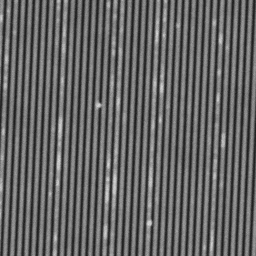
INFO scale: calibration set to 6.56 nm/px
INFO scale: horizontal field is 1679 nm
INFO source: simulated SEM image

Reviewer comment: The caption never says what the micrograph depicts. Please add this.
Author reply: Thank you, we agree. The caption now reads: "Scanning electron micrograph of parallel lines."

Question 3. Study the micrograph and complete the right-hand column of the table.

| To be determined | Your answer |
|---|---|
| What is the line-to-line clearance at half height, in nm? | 17.2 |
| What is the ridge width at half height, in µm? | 0.0287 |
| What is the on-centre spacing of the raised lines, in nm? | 46.7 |